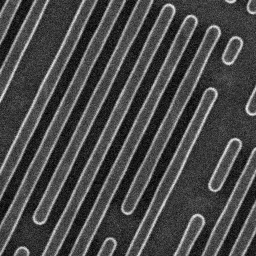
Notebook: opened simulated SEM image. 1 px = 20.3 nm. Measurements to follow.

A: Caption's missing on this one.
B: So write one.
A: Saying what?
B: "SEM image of groups of lines, slits or small figures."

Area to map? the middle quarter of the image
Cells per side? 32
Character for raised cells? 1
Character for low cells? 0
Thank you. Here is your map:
00001110000111000011100001110000
00011110001111000111100011110001
00011100001110000111000011100001
00111100011100001111000111000011
00111000011100001110000111000011
01111000111100011110001111000111
01110000111000011100001110001111
01110001111000111100011110001111
11100001110000111000011100001110
11100011110001111000111000011110
11000011100001110000111000011100
11000011100011110001111000111100
10000111000011100001110000111000
10001111000111100011110001111000
00001110000111000011100001110000
00011110001111000111100011110001
00011100001110000111000011100001
00011100001110001111000111100011
00111000011100001110000111000011
01111000111100011110001111000111
01110000111000011100001110000111
01110000111000111100011110001111
11100001110000111000011100001110
11100011110001111000111100011110
11000011100001110000111000011100
11000011100011110001111000111100
10000111000011100001110000111000
10001111000111100011110001111000
10001111000111000011100001110000
00001110001111000111100011110000
00011100001110000111100011100000
00011100011110001111000111100000